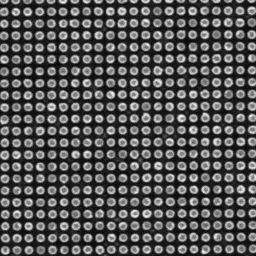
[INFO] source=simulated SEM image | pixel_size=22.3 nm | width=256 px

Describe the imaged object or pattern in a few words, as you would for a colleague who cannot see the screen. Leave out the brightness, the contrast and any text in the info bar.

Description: a regular array of raised bodies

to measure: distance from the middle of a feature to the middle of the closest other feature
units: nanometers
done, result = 254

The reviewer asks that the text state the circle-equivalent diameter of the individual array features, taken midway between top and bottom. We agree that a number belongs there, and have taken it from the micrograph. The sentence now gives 176 nm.